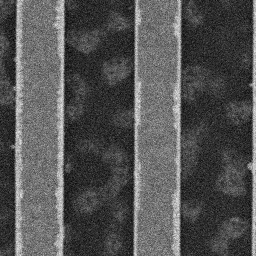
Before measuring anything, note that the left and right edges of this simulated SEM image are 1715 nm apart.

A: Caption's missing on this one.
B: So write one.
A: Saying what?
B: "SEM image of one or a few lines or trenches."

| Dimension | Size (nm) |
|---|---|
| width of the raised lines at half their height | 297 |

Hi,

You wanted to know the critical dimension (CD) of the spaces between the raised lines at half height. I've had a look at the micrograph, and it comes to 498 nanometers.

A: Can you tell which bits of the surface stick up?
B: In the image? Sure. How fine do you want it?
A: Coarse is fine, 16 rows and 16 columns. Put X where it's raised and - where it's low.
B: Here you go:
-XXX-----XX-----
-XXX-----XX-----
-XXX-----XX-----
-XXX-----XX-----
-XXX-----XX-----
-XXX-----XX-----
-XXX-----XX-----
-XXX----XXX-----
-XXX-----XX-----
-XXX-----XX-----
-XXX----XXX-----
-XXX-----XX-----
-XXX----XXX-----
-XXX----XXX-----
-XXX----XXX-----
-XXX----XXX-----